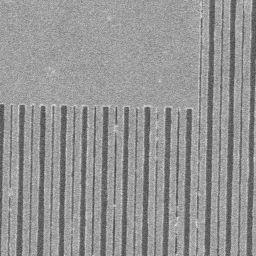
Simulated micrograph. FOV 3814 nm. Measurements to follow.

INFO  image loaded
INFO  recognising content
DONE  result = parallel lines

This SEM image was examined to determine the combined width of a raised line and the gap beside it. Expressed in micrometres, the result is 0.155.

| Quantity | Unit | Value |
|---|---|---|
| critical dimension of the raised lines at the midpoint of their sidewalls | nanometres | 95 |